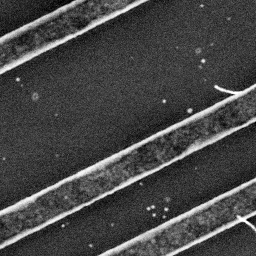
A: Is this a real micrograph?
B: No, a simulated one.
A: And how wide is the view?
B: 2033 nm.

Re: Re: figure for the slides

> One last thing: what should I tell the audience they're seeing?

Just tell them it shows lines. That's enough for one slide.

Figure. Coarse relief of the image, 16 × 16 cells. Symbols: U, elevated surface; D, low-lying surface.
DDDDUUUUDDDDDDDD
DDUUUUDDDDDDDDDD
UUUUDDDDDDDDDDDD
UUDDDDDDDDDDDDDD
DDDDDDDDDDDDDDDD
DDDDDDDDDDDDDDDD
DDDDDDDDDDDDDDUU
DDDDDDDDDDDDUUUU
DDDDDDDDDDUUUUDD
DDDDDDDDUUUUDDDD
DDDDDDUUUUDDDDDD
DDDDUUUUDDDDDDDU
DDUUUUDDDDDDDUUU
UUUUDDDDDDDUUUUU
UUDDDDDDDUUUUUDD
DDDDDDDUUUUUDDDD